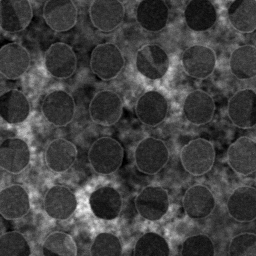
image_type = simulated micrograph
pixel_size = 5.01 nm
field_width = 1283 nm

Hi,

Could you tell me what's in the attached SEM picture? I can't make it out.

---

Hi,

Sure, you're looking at a regular array of raised bodies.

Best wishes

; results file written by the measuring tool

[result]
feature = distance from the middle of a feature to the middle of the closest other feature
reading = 230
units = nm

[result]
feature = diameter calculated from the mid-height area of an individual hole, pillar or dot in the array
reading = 170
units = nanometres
